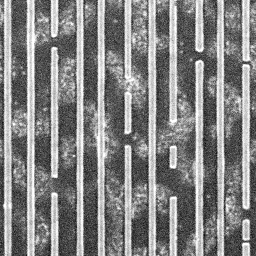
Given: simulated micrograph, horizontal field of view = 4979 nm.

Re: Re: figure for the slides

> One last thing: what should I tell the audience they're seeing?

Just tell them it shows parallel lines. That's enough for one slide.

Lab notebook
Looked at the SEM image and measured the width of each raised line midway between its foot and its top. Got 97.3 nm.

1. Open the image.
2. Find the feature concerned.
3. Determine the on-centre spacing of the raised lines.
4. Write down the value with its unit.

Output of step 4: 463 nm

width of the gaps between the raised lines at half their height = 367 nm